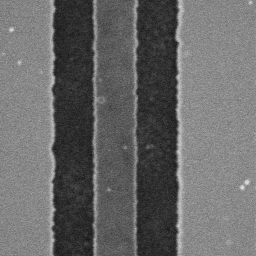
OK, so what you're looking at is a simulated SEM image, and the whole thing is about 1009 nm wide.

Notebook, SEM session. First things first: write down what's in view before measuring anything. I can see lines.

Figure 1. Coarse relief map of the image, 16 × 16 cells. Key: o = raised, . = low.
ooo...ooo..ooooo
ooo...oo...ooooo
ooo...ooo..ooooo
ooo...oo...ooooo
ooo...oo...ooooo
ooo...oo...ooooo
ooo...ooo..ooooo
ooo...oo...ooooo
ooo...oo...ooooo
ooo...ooo..ooooo
ooo...ooo..ooooo
ooo...oo...ooooo
ooo...oo...ooooo
ooo...oo...ooooo
ooo...oo...ooooo
ooo...ooo..ooooo